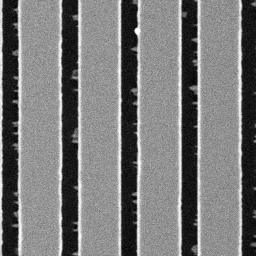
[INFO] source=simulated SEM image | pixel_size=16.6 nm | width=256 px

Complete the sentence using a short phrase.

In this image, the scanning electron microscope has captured lines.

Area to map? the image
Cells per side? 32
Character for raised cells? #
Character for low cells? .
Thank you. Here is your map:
..######..#####..######..#####..
..######..#####..######..#####..
..######..#####..######..#####..
..######..#####..######..#####..
..######..#####..######..#####..
..######..#####..######..#####..
..######..#####..######..#####..
..######..#####..######..#####..
..######..#####..######..#####..
..######..#####..######..#####..
..######..#####..######..#####..
..######..#####..######..#####..
..######..#####..######..#####..
..######..#####..######..#####..
..######..#####..######..#####..
..######..#####..######..#####..
..######..#####..######..#####..
..######..#####..######..#####..
..######..#####..######..#####..
..######..#####..######..#####..
..######..#####..######..#####..
..######..#####..######..#####..
..######..#####..######..#####..
..######..#####..######..#####..
..######..#####..######..#####..
..######..#####..######..#####..
..######..#####..######..#####..
..######..#####..######..#####..
..######..#####..######..#####..
..######..#####..######..#####..
..######..#####..######..#####..
..######..#####..######..#####..